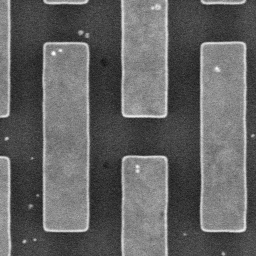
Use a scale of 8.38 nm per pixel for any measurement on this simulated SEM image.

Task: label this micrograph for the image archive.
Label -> groups of lines, slits or small figures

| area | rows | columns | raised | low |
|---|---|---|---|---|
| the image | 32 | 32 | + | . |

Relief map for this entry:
+..............++++++...........
+..............++++++...........
+..............++++++...........
+..............++++++...........
+..............++++++...........
+.....+++++....++++++.....++++..
+.....+++++....++++++....++++++.
+.....+++++....++++++....++++++.
+....++++++....++++++....++++++.
+....++++++....++++++....++++++.
+....++++++....++++++....++++++.
+.....+++++....++++++....++++++.
+....++++++....++++++....++++++.
+....++++++....++++++....++++++.
+.....+++++.....++++.....++++++.
......+++++..............++++++.
......+++++..............++++++.
......+++++..............++++++.
......+++++..............++++++.
......+++++..............++++++.
+.....+++++....++++++....++++++.
+.....+++++....++++++....++++++.
+.....+++++....++++++....++++++.
+.....+++++....++++++....++++++.
+.....+++++....++++++....++++++.
+.....+++++....++++++....++++++.
+.....+++++....++++++....++++++.
+.....+++++....++++++....++++++.
+.....+++++....++++++....++++++.
+..............++++++...........
+..............++++++...........
+..............++++++...........